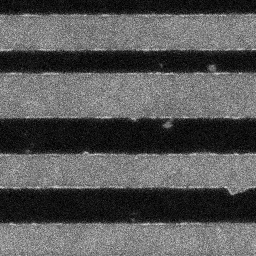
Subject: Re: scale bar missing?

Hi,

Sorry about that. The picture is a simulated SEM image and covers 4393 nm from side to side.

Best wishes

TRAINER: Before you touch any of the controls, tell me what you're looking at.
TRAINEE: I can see one or a few lines or trenches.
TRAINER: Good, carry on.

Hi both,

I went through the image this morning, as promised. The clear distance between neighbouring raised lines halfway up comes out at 581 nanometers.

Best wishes